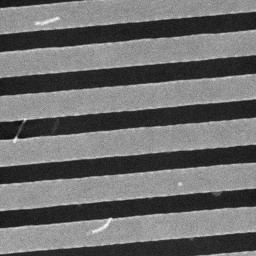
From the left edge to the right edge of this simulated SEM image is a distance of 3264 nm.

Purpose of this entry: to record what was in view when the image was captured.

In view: lines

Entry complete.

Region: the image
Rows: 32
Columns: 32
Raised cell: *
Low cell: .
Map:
......**************************
********************************
*******************.............
*********.......................
.......................*********
.............*******************
********************************
**************************......
***************.................
**...........................***
..................**************
.......*************************
*******************************.
********************............
*********.......................
.......................*********
............********************
.*******************************
**************************......
***************.................
****..........................**
...................*************
.......*************************
********************************
*********************...........
*********.......................
........................********
.............*******************
********************************
**************************......
***************.................
**............................**